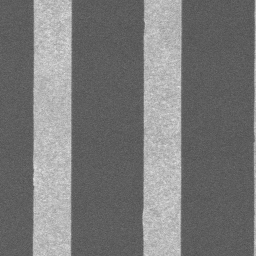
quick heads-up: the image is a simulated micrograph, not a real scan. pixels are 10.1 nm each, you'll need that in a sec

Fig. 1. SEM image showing one or a few lines or trenches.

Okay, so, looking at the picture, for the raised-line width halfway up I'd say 370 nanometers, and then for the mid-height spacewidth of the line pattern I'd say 744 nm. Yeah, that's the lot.